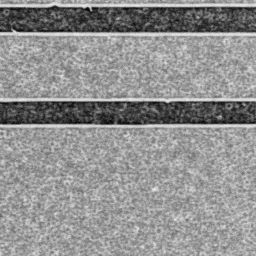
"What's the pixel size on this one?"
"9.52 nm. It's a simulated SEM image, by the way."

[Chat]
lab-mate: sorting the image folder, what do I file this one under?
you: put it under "one or a few lines or trenches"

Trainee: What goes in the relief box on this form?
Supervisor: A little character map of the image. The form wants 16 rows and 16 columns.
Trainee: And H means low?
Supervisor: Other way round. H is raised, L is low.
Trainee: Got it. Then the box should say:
LLLLLLLLLLLLLLLL
LLLLLLLLLLLLLLLL
HHHHHHHHHHHHHHHH
HHHHHHHHHHHHHHHH
HHHHHHHHHHHHHHHH
HHHHHHHHHHHHHHHH
LLLLLLLLLLLLLLLL
LLLLLLLLLLLLLLLL
HHHHHHHHHHHHHHHH
HHHHHHHHHHHHHHHH
HHHHHHHHHHHHHHHH
HHHHHHHHHHHHHHHH
HHHHHHHHHHHHHHHH
HHHHHHHHHHHHHHHH
HHHHHHHHHHHHHHHH
HHHHHHHHHHHHHHHH